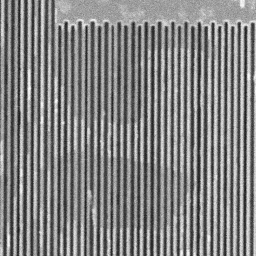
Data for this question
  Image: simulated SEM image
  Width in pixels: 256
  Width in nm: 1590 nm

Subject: parallel lines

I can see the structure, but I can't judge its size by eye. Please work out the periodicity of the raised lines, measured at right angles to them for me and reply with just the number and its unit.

41.4 nanometers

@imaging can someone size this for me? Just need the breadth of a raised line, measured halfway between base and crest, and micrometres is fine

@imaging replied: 0.0171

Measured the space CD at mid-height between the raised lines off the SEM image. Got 23.3 nanometers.